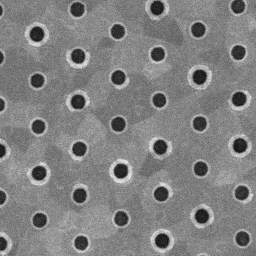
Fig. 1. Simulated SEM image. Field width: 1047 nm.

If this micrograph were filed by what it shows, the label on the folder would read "a regular array of holes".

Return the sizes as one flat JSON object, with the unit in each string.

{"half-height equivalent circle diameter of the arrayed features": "65.5 nm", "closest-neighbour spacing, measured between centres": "188 nanometres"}